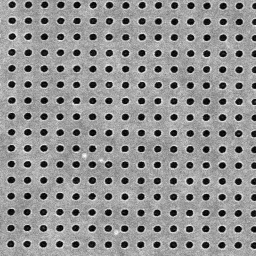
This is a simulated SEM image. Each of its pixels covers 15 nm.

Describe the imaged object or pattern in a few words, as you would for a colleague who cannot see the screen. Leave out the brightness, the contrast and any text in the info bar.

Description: a regular array of holes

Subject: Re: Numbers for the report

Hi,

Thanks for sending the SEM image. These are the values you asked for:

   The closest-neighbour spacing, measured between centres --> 237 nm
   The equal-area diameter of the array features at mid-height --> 109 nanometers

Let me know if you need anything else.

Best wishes